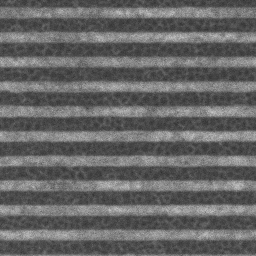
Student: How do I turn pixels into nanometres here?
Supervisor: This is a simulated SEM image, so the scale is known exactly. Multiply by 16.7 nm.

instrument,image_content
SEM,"parallel lines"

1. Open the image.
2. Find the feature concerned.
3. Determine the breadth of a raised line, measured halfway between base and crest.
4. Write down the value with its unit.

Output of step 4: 0.261 um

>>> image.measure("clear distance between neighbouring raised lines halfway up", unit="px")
9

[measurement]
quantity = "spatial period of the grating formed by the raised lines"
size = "413 nm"